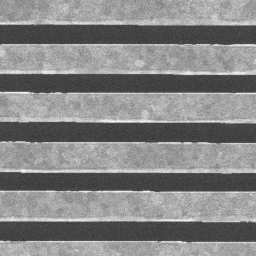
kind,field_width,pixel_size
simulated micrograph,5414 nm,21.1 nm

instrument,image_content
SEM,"lines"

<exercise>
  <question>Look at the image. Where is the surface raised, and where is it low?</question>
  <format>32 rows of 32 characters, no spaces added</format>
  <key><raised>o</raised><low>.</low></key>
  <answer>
oooooooooooooooooooooooooooooooo
oooooooooooooooooooooooooooooooo
oooooooooooooooooooooooooooooooo
................................
................................
................................
oooooooooooooooooooooooooooooooo
oooooooooooooooooooooooooooooooo
oooooooooooooooooooooooooooooooo
................................
................................
................................
oooooooooooooooooooooooooooooooo
oooooooooooooooooooooooooooooooo
oooooooooooooooooooooooooooooooo
................................
................................
................................
oooooooooooooooooooooooooooooooo
oooooooooooooooooooooooooooooooo
oooooooooooooooooooooooooooooooo
................................
................................
................................
oooooooooooooooooooooooooooooooo
oooooooooooooooooooooooooooooooo
oooooooooooooooooooooooooooooooo
................................
................................
................................
oooooooooooooooooooooooooooooooo
oooooooooooooooooooooooooooooooo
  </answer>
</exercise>